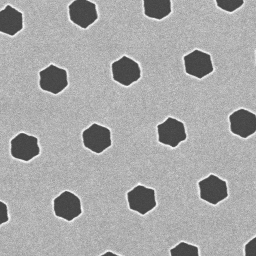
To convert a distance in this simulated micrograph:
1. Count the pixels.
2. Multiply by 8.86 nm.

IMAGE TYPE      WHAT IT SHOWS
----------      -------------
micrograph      a regular array of holes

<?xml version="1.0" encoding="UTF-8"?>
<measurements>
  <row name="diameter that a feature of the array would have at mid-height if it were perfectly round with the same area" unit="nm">249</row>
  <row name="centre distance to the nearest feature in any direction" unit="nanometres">645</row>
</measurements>